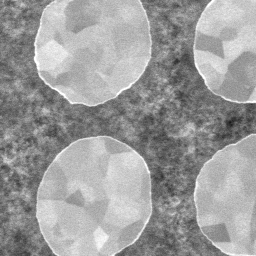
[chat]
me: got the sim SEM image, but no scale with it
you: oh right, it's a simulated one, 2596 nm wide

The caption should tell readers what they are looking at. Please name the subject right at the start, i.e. raised bodies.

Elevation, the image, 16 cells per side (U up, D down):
DDDUUUUUUDDDDUUU
DDDUUUUUUDDDUUUU
DDUUUUUUUDDDUUUU
DDUUUUUUUDDDUUUU
DDUUUUUUUDDDUUUU
DDDUUUUUDDDDDUUU
DDDDDUDDDDDDDDDD
DDDDDDDDDDDDDDDD
DDDDDDDDDDDDDDDD
DDDDUUUUDDDDDDUU
DDDUUUUUUDDDDUUU
DDDUUUUUUDDDUUUU
DDUUUUUUUDDDUUUU
DDUUUUUUUDDDUUUU
DDDUUUUUUDDDDUUU
DDDUUUUUDDDDDDUU